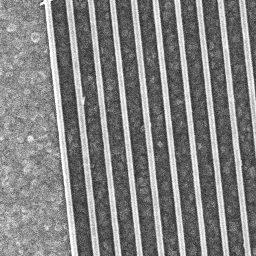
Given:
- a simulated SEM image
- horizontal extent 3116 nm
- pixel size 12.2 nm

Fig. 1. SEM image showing parallel lines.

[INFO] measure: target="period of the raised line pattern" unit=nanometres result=262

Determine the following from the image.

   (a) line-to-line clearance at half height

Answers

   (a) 0.201 um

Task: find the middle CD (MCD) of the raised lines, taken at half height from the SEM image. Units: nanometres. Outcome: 55.9